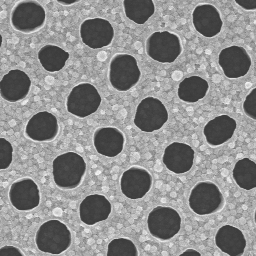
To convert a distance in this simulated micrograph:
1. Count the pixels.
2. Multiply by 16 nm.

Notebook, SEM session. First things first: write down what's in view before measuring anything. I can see a regular array of holes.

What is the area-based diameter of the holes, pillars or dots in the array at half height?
31.2 px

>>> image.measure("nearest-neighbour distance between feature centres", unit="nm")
778